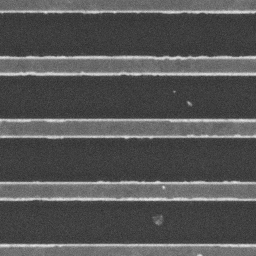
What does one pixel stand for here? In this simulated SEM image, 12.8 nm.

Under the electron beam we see lines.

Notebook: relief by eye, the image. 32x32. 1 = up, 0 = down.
11111111111111111111111111111111
00000000000000000000000000000000
00000000000000000000000000000000
00000000000000000000000000000000
00000000000000000000000000000000
00000000000000000000000000000000
00000000000000000000000000000000
11111111111111111111111111111111
11111111111111111111111111111111
00000000000000000000000000000000
00000000000000000000000000000000
00000000000000000000000000000000
00000000000000000000000000000000
00000000000000000000000000000000
00000000000000000000000000000000
11111111111111111111111111111111
11111111111111111111111111111111
00000000000000000000000000000000
00000000000000000000000000000000
00000000000000000000000000000000
00000000000000000000000000000000
00000000000000000000000000000000
00000000000000000000000000000000
11111111111111111111111111111111
11111111111111111111111111111111
00000000000000000000000000000000
00000000000000000000000000000000
00000000000000000000000000000000
00000000000000000000000000000000
00000000000000000000000000000000
00000000000000000000000000000000
11111111111111111111111111111111